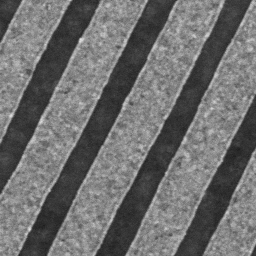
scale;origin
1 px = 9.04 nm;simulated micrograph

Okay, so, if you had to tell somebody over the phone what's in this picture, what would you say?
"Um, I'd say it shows one or a few lines or trenches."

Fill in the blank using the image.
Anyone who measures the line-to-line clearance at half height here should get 246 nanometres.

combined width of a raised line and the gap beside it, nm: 625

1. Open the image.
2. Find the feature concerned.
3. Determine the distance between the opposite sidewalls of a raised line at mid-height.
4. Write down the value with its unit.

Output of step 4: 376 nm